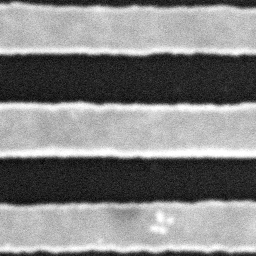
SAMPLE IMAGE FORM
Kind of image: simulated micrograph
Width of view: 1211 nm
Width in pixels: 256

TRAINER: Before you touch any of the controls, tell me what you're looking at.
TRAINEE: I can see lines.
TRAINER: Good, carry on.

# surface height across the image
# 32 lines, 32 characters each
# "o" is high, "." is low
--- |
.oo.............................
oooooooooooooooooooooooooooooooo
oooooooooooooooooooooooooooooooo
oooooooooooooooooooooooooooooooo
oooooooooooooooooooooooooooooooo
oooooooooooooooooooooooooooooooo
oooooooooooooooooooo.ooooooooooo
................................
................................
................................
................................
................................
................................
oooooooooooooooooooooooooooooooo
oooooooooooooooooooooooooooooooo
oooooooooooooooooooooooooooooooo
oooooooooooooooooooooooooooooooo
oooooooooooooooooooooooooooooooo
oooooooooooooooooooooooooooooooo
o..............o..o.............
................................
................................
................................
................................
................................
...................oooo..ooooooo
oooooooooooooooooooooooooooooooo
oooooooooooooooooooooooooooooooo
oooooooooooooooooooooooooooooooo
oooooooooooooooooooooooooooooooo
oooooooooooooooooooooooooooooooo
................................